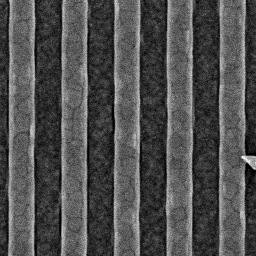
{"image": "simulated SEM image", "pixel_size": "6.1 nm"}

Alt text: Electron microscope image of wiring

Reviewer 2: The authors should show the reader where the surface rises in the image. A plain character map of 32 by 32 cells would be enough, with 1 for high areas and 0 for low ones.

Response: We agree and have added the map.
01110000111000111000011100001110
01110000111000111000011100011110
01110000111000111000011100001110
01110000111000111000011100001110
01110000111000111000011100001100
01110000111000111000011100001110
01110000111000111000011100001110
01110000111000111000011100001110
01110000111000111000011100001110
01110000111000111000011100001110
01110000111000111000011100001110
01110000111000111000011100011110
01110000111000111000011100011100
01110000111000111000011100011100
01110000111000111000011100011110
01110000111000111000011100011110
01110000111000111000011100001110
01110000111000111000011100001100
01110000111000111000011100011110
01110000111000111000011100011110
01110000111000111000011100011111
01110000111000111000011100011110
01110000111000111000011100011110
01110000111000111000011100011110
01110000111000111000011100011100
01110000111000111000011100011100
01110000111000111000011100011110
01110000111000111000011100011110
01110000111000111000011100011110
01110000111000111000011100011110
01110000111000111000011100011100
01110000111000111000011100011100